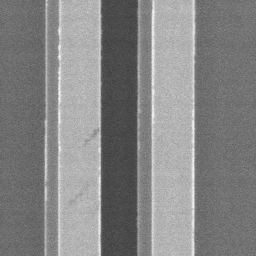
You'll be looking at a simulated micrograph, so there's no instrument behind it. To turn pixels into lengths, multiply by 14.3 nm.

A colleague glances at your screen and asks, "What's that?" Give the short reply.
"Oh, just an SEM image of lines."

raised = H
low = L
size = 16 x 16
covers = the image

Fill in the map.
LLLHHHLLLHHHLLLL
LLLHHHLLLHHHLLLL
LLLHHHLLLHHHLLLL
LLLHHHLLLHHHLLLL
LLLHHHLLLHHHLLLL
LLLHHHLLLHHHLLLL
LLLHHHLLLHHHLLLL
LLLHHHLLLHHHLLLL
LLLHHHLLLHHHLLLL
LLLHHHLLLHHHLLLL
LLLHHHLLLHHHLLLL
LLLHHHLLLHHHLLLL
LLLHHHLLLHHHLLLL
LLLHHHLLLHHHLLLL
LLLHHHLLLHHHLLLL
LLLHHHLLLHHHLLLL